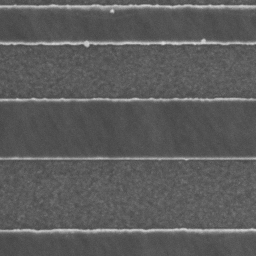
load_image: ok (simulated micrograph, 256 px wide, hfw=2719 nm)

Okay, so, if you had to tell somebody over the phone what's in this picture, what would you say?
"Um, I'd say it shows lines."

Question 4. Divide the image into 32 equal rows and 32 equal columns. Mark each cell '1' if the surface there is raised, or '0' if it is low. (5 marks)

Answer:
00000000000000000000000000000000
11111111111111111111111111111111
11111111111111111111111111111111
11111111111111111111111111111111
11111111111111111111111111111111
10011110011100000000000000001000
00000000000000000000000000000000
00000000000000000000000000000000
00000000000000000000000000000000
00000000000000000000000000000000
00000000000000000000000000000000
00000000000000000000000000000000
11111111111111111111111111111111
11111111111111111111111111111111
11111111111111111111111111111111
11111111111111111111111111111111
11111111111111111111111111111111
11111111111111111111111111111111
11111111111111111111111111111111
11111111111111111111111111111111
00000000000000000000000000000000
00000000000000000000000000000000
00000000000000000000000000000000
00000000000000000000000000000000
00000000000000000000000000000000
00000000000000000000000000000000
00000000000000000000000000000000
00000000000000000000000000000000
00000000000000000000000000000000
11111111111111111111111111111111
11111111111111111111111111111111
11111111111111111111111111111111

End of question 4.